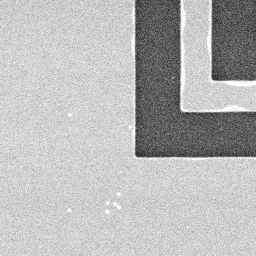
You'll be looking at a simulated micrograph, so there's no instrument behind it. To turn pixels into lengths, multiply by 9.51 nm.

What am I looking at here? groups of lines, slits or small figures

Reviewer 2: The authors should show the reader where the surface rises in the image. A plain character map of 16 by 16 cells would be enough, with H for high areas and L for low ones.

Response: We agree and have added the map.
HHHHHHHHLLLHHLLL
HHHHHHHHLLLHHLLL
HHHHHHHHLLLHHLLL
HHHHHHHHLLLHHLLL
HHHHHHHHLLLHHLLL
HHHHHHHHLLLHHHHH
HHHHHHHHLLLHHHHH
HHHHHHHHLLLLLLLL
HHHHHHHHLLLLLLLL
HHHHHHHHHLLLLLLL
HHHHHHHHHHHHHHHH
HHHHHHHHHHHHHHHH
HHHHHHHHHHHHHHHH
HHHHHHHHHHHHHHHH
HHHHHHHHHHHHHHHH
HHHHHHHHHHHHHHHH